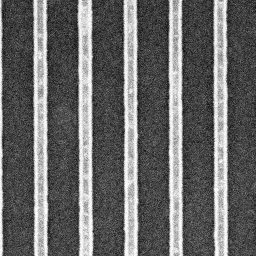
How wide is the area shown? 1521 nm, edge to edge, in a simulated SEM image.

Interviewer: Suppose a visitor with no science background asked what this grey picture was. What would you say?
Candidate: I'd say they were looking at parallel lines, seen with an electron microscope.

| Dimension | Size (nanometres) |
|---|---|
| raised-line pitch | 267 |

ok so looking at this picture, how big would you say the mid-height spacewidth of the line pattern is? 35.6 pixels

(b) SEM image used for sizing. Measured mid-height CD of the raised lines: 56.4 nanometres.